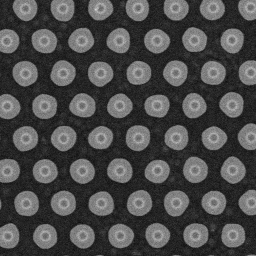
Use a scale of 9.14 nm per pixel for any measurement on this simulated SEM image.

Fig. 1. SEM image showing an array of small figures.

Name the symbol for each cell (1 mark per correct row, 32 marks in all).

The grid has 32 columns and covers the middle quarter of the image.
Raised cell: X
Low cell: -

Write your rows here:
XX-----XXXX-----XXXXX----XXXXXX-
XXX---XXXXXX----XXXXXX---XXXXXX-
XXX---XXXXXX----XXXXXX---XXXXXX-
XXX---XXXXXX----XXXXX----XXXXXX-
XX-----XXXX-----XXXXX-----XXXX--
--------XX----------------------
--------------------------------
----X--------XX----------------X
--XXXXX-----XXXX-----XXXXX----XX
--XXXXXX---XXXXXX---XXXXXX----XX
-XXXXXXX---XXXXXX---XXXXXX----XX
--XXXXXX---XXXXXX---XXXXXX----XX
--XXXXX----XXXXX-----XXXXX----XX
--------------------------------
--------------------------------
-----------------XXX--------X---
XX-----XXXXX----XXXXX-----XXXXX-
XXX---XXXXXX----XXXXX----XXXXXX-
XXX---XXXXXX----XXXXX----XXXXXX-
XXX---XXXXXX----XXXXX----XXXXXX-
XX-----XXXX-----XXXXX-----XXXX--
X----------------XXX------------
--------------------------------
-------------------------------X
--XXXX------XXXX------XXX-----XX
--XXXXX----XXXXXX----XXXXX----XX
--XXXXXX---XXXXXX---XXXXXX----XX
--XXXXXX---XXXXXX---XXXXXX----XX
--XXXXX-----XXXXX----XXXXX----XX
---XXX--------XX------XXX-------
--------------------------------
--------------------------------